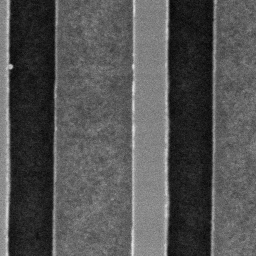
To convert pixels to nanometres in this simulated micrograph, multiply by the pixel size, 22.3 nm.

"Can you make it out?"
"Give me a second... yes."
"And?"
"lines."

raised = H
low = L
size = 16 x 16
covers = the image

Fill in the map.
HLLLHHHHHHLLLHHH
HLLLHHHHHHLLLHHH
HLLLHHHHHHLLLHHH
HLLLHHHHHHLLLHHH
HLLLHHHHHHLLLHHH
HLLHHHHHHHLLLHHH
LLLHHHHHHHLLLHHH
LLLHHHHHHHLLLHHH
HLLHHHHHHHLLLHHH
HLLHHHHHHHLLLHHH
HLLHHHHHHHLLLHHH
HLLHHHHHHHLLLHHH
LLLHHHHHHHLLLHHH
LLLHHHHHHHLLLHHH
LLLHHHHHHHLLLHHH
LLLHHHHHHHLLLHHH